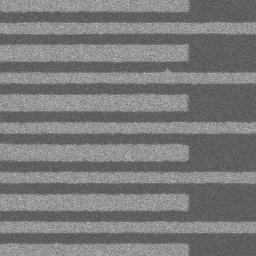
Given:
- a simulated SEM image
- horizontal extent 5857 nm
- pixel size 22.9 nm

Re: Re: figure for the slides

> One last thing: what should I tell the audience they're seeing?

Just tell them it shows parallel lines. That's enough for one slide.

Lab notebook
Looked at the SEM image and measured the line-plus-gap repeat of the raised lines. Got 562 nm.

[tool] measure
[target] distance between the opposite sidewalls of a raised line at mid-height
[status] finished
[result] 286 nanometres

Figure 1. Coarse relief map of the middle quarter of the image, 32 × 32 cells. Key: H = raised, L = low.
HHHHHHHHHHHHHHHHHHHHHHHHHHHHHHHH
HHHHHHHHHHHHHHHHHHHHHHHHHHHHHHHH
LLLLLLLLLLLLLLLLLLLLLLLLLLLLLLLL
LLLLLLLLLLLLLLLLLLLLLLLLLLLLLLLL
LLLLLLLLLLLLLLLLLLLLLLLLLLLLLLLL
HHHHHHHHHHHHHHHHHHHHHHHHHHHHHHHH
HHHHHHHHHHHHHHHHHHHHHHHHHHHHHHHH
HHHHHHHHHHHHHHHHHHHHHHHHHHHHHHHH
LLLLLLLLLLLLLLLLLLLLLLLLLLLLLLLH
LLLLLLLLLLLLLLLLLLLLLLLLLLLLLLLH
LLLLLLLLLLLLLLLLLLLLLLLLLLLLLLLH
LLLLLLLLLLLLLLLLLLLLLLLLLLLLLLLH
HHHHHHHHHHHHHHHHHHHHHHHHHHHHHHHH
HHHHHHHHHHHHHHHHHHHHHHHHHHHHHHHH
HHHHHHHHHHHHHHHHHHHHHHHHHHHHHHHH
LLLLLLLLLLLLLLLLLLLLLLLLLLLLLLLL
LLLLLLLLLLLLLLLLLLLLLLLLLLLLLLLL
HHHHHHHHHHHHHHHHHHHHHHHHHHHHHHHH
HHHHHHHHHHHHHHHHHHHHHHHHHHHHHHHH
HHHHHHHHHHHHHHHHHHHHHHHHHHHHHHHH
LLLLLLLLLLLLLLLLLLLLLLLLLLLLLLLH
LLLLLLLLLLLLLLLLLLLLLLLLLLLLLLLH
LLLLLLLLLLLLLLLLLLLLLLLLLLLLLLLH
LLLLLLLLLLLLLLLLLLLLLLLLLLLLLLLH
HHHHHHHHHHHHHHHHHHHHHHHHHHHHHHHH
HHHHHHHHHHHHHHHHHHHHHHHHHHHHHHHH
HHHHHHHHHHHHHHHHHHHHHHHHHHHHHHHH
LLLLLLLLLLLLLLLLLLLLLLLLLLLLLLLL
LLLLLLLLLLLLLLLLLLLLLLLLLLLLLLLL
LLLLLLLLLLLLLLLLLLLLLLLLLLLLLLLL
HHHHHHHHHHHHHHHHHHHHHHHHHHHHHHHH
HHHHHHHHHHHHHHHHHHHHHHHHHHHHHHHH